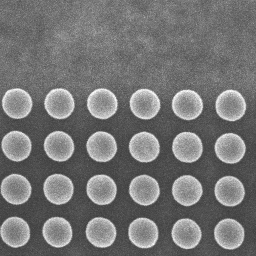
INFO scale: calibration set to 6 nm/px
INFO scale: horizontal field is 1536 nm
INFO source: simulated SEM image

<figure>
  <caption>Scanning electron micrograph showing a regular array of raised bodies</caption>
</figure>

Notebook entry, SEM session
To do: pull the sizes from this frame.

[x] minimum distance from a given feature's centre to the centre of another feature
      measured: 255 nm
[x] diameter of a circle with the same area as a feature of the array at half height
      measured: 180 nm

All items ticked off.